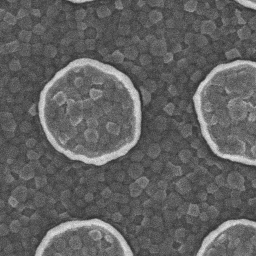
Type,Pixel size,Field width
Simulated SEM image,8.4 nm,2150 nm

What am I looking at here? raised bodies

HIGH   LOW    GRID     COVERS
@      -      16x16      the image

----------------
----------------
----------------
----------------
----@@@------@@@
---@@@@@----@@@@
---@@@@@@---@@@@
---@@@@@@----@@@
---@@@@@@----@@@
----@@@@------@@
----------------
----------------
----------------
----------------
---@@@@-------@@
---@@@@@-----@@@